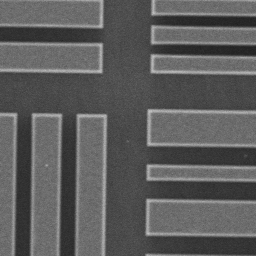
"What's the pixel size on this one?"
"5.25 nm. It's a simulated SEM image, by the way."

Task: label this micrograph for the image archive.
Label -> groups of lines, slits or small figures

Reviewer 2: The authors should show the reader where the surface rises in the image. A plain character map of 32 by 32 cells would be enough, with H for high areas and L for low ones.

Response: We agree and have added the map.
HHHHHHHHHHHHHLLLLLLHHHHHHHHHHHHH
HHHHHHHHHHHHHLLLLLLHHHHHHHHHHHHH
HHHHHHHHHHHHHLLLLLLLLLLLLLLLLLLL
LLLLLLLLLLLLLLLLLLLHHHHHHHHHHHHH
LLLLLLLLLLLLLLLLLLLHHHHHHHHHHHHH
HHHHHHHHHHHHLLLLLLLLLLLLLLLLLHHH
HHHHHHHHHHHHHLLLLLLLLLLLLLLLLLLL
HHHHHHHHHHHHHLLLLLLHHHHHHHHHHHHH
HHHHHHHHHHHHHLLLLLLHHHHHHHHHHHHH
LLLLLLLLLLLLLLLLLLLLLLLLLLLLLLLL
LLLLLLLLLLLLLLLLLLLLLLLLLLLLLLLL
LLLLLLLLLLLLLLLLLLLLLLLLLLLLLLLL
LLLLLLLLLLLLLLLLLLLLLLLLLLLLLLLL
LLLLLLLLLLLLLLLLLLLLLLLLLLLLLLLL
HHLLHHHLLLHHHLLLLLLHHHHHHHHHHHHH
HHLLHHHHLLHHHLLLLLLHHHHHHHHHHHHH
HHLLHHHHLLHHHLLLLLLHHHHHHHHHHHHH
HHLLHHHHLLHHHLLLLLHHHHHHHHHHHHHH
HHLLHHHHLLHHHLLLLLLLLLLLLLLLLLLL
HHLLHHHHLLHHHLLLLLLLLLLLLLLLLLLL
HHLLHHHLLLHHHLLLLLLLLLLLLLLLLLLL
HHLLHHHLLLHHHLLLLLHHHHHHHHHHHHHH
HHLLHHHLLLHHHLLLLLLLHHHHHHHHHHHH
HHLLHHHLLLHHHLLLLLLLLLLLLLLLLLLL
HHLLHHHLLLHHHLLLLLLLLLLLLLLLLLLL
HHLLHHHLLLHHHLLLLLHHHHHHHHHHHHHH
HHLLHHHLLLHHHLLLLLHHHHHHHHHHHHHH
HHLLHHHLLLHHHLLLLLHHHHHHHHHHHHHH
HHLLHHHLLLHHHLLLLLHHHHHHHHHHHHHH
HHLLHHHLLLHHHLLLLLLLLLLLLLLLLLLL
HHLLHHHLLLHHHLLLLLLLLLLLLLLLLLLL
HHLLHHHLLLHHHLLLLLLLLLLLLLLLLLLL